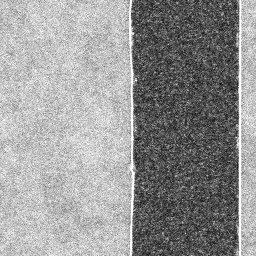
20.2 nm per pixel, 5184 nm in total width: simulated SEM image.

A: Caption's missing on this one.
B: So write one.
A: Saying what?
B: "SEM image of one or a few lines or trenches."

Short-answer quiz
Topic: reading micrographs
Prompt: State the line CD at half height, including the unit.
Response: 2200 nanometres